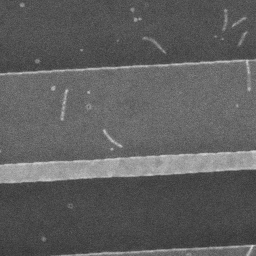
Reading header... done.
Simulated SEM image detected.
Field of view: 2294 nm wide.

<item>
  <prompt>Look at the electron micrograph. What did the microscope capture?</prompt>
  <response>lines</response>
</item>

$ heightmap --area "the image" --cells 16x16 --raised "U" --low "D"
DDDDDDDDDDDDDDDD
DDDDDDDDDDDDDDDD
DDDDDDDDDDDDDDDD
DDDDDDDDDDDDDDDD
DDDUUUUUUUUUUUUU
UUUUUUUUUUUUUUUU
UUUUUUUUUUUUUUUU
UUUUUUUUUUUUUUUU
UUUUUUUUUUUUUUUU
UUUUUUUUUUUUUUUU
UUUUUUUUUUUUUUUU
DDDDDDDDDDDDDDDD
DDDDDDDDDDDDDDDD
DDDDDDDDDDDDDDDD
DDDDDDDDDDDDDDDD
DDDDDDDDDDDDDUUU